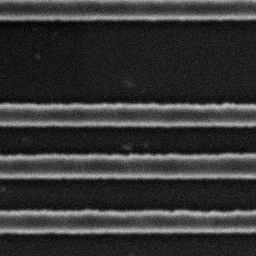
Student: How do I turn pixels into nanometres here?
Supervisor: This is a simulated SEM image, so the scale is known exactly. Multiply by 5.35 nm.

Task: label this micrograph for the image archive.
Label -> lines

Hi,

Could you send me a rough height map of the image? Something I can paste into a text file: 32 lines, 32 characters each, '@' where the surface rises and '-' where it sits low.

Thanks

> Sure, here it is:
@@@@@@@@@@@@@@@@@@@@@@@@@@@@@@@@
@@@@@@@@@@@@@@@@@@@@@@@@@@@@@@@@
--------------------------------
--------------------------------
--------------------------------
--------------------------------
--------------------------------
--------------------------------
--------------------------------
--------------------------------
--------------------------------
--------------------------------
--------------------------------
@@@@@@@@@@@@@@@@@@@@@@@@@@@@@@@@
@@@@@@@@@@@@@@@@@@@@@@@@@@@@@@@@
@@@@@@@@@@@@@@@@@@@@@@@@@@@@@@@@
--------------------------------
--------------------------------
--------------------------------
--@--@@----@@---@@@-@@---@@@@@@@
@@@@@@@@@@@@@@@@@@@@@@@@@@@@@@@@
@@@@@@@@@@@@@@@@@@@@@@@@@@@@@@@@
--------------------------------
--------------------------------
--------------------------------
--------------------------------
@@@@@@@@@@@@@@---@@@@-@@-----@@@
@@@@@@@@@@@@@@@@@@@@@@@@@@@@@@@@
@@@@@@@@@@@@@@@@@@@@@@@@@@@@@@@@
--------------------------------
--------------------------------
--------------------------------